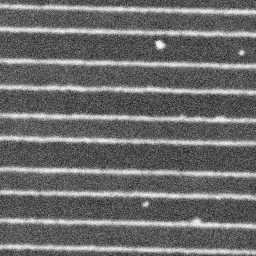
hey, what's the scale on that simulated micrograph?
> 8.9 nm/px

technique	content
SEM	lines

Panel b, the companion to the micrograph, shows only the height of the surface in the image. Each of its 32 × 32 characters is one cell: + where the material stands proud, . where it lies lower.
................................
++++++++++++++++++++++++++++++++
++++++++++++++++++++++++++++++++
++++++++++++++++++++++++++++++++
................................
................................
................................
................................
++++++++++++++++++++++++++++++++
++++++++++++++++++++++++++++++++
++++++++++++++++++++++++++++++++
...........................+++++
................................
................................
++++++..........................
++++++++++++++++++++++++++++++++
++++++++++++++++++++++++++++++++
........++++++++++++++++++++++++
................................
................................
................................
+++++++++++++++++...............
++++++++++++++++++++++++++++++++
++++++++++++++++++++++++++++++++
.....................+++++++++++
................................
................................
................................
++++++++++++++++++++++++++++++++
++++++++++++++++++++++++++++++++
++++++++++++++++++++++++++++++++
.......................+.+++++++